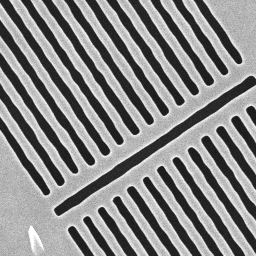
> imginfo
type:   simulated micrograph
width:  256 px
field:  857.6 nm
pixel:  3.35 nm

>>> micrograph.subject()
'groups of lines, slits or small figures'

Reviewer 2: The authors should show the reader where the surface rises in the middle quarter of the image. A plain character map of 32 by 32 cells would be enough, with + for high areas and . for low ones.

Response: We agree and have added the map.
...++...+++..+++...+++..+++...++
+..+++...+++..+++...++...+++..++
+...+++...++...+++..+++..+++...+
++...++...+++...++...+++..+++...
+++..+++...+++..+++..+++...+++..
.++...+++..+++...+++..+++...++..
..++...+++..+++...++...+++..+++.
..+++..+++...+++..+++..++++..+++
...++...+++...++...+++..+++...++
+...++...++...+++...++...+++..++
+...+++...++...+++..+++...++++++
++...++...+++...++...+++..++++++
+++..+++...+++..+++...++..++++++
.++...+++...++...+++..+++++++++.
.+++...+++..+++...++..++++++++..
..+++..+++...+++..++++++++++....
...++...+++..+++...++++++++....+
+..+++...++...+++.+++++++....+++
++..+++..+++...+++++++++....++++
++...+++..+++..+++++++.....+++++
+++..+++...++++++++++....+++++++
.++...+++...+++++++.....+++++++.
..++...++..+++++++....+++++++++.
..+++..+++++++++.....+++++++.+++
...++...++++++.....++++++++...++
+..++++++++++.....++++++++++..++
+...++++++++....+++++++...++...+
++++++++++.....+++++++++..+++..+
+++++++++.....++++++.+++...+++..
+++++++.....++++++++..+++...++..
+++++.....++++++++++...+++..+++.
++++.....+++++++..+++..+++...+++